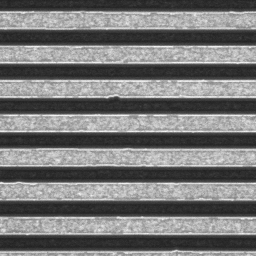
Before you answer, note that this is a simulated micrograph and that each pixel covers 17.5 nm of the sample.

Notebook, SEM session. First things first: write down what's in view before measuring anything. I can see parallel lines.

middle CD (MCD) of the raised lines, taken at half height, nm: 341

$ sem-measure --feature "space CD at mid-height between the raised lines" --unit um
0.247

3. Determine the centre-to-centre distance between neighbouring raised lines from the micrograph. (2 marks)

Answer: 0.6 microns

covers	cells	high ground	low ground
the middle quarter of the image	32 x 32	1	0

00000000000000000000000000000000
00000000000000000000000000000000
00000000000000000000000000000000
00000000000000000000000000000000
11111111111111111111111111111111
11111111111111111111111111111111
11111111111111111111111111111111
11111111111111111111111111111111
00000000000000000000000000011111
00000000000000000000000000000000
00000000000000000000000000000000
00000000000000000000000000000000
11111111111111111111111111111111
11111111111111111111111111111111
11111111111111111111111111111111
11111111111111111111111111111111
11111111111111111111111111111111
00000000000000000000000000000000
00000000000000000000000000000000
00000000000000000000000000000000
00000000000000000000000000000000
11111111111111111111111111111111
11111111111111111111111111111111
11111111111111111111111111111111
11111111111111111111111111111111
11111111111111111111111111111111
00000000000000000000000000000000
00000000000000000000000000000000
00000000000000000000000000000000
00000000000000000000000000000000
11111111111111111111111111111111
11111111111111111111111111111111